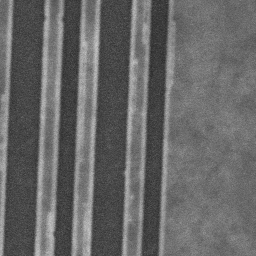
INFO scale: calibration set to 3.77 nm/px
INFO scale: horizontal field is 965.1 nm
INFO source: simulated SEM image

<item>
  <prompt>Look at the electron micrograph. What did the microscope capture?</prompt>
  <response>parallel lines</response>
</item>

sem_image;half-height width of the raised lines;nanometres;58.9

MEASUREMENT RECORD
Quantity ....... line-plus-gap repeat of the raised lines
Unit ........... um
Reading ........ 0.165